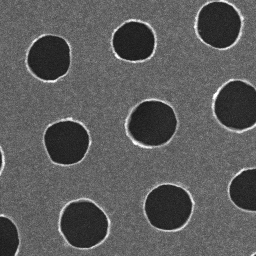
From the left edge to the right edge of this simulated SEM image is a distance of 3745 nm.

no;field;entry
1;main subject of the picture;holes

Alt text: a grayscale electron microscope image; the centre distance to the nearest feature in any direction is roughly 1230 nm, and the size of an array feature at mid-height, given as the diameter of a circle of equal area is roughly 662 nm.